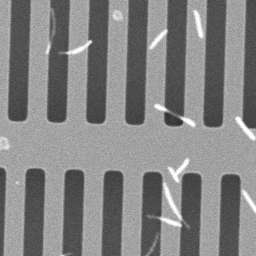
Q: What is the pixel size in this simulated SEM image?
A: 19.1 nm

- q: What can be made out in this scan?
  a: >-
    groups of lines, slits or small figures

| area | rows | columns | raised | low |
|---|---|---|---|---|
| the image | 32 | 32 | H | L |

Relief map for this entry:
HLLLHHLLLHHLLLHHLLLHHLLHHHLLHHHL
HLLLHHLLLHHLLLHHLLLHHLLHHHLLHHHL
HLLLHHLLLHHLLLHHLLHHHLLHHHLLHHHL
HLLLHHLLLHHLLLHHLLHHHLLHHHLLHHHL
HLLLHHLLLHHLLLHHLLHHHLLHHHLLHHLL
HLLLHHLLLHHLLLHHLLHHHLLHHHLLHHLL
HLLLHHLLHHHLLHHHLLHHHLLHHHLLHHLL
HLLLHHLLLHHLLHHHLLHHHLLHHHLLHHLL
HLLLHHLLLHHLLHHHLLHHHLLHHLLLHHLL
HLLLHHLLHHHLLHHHLLHHHLLHHLLLHHLL
HLLLHHLLHHHLLHHHLLHHHLLHHLLLHHLL
HLLLHHLLHHHLLHHHLLHHLLLHHLLLHHLL
HLLLHHLLHHHLLHHHLLHHLLLHHLLLHHLL
HLLHHHLLHHHLLHHHLLHHHLLHHLLLHHLL
HLLHHHLLHHHLLHHHLLHHHLLHHLLLHHLL
HHHHHHHHHHHHHHHHLLHHHLLHHLLLHHLL
HHHHHHHHHHHHHHHHHHHHHHHHHHHHHHHH
HHHHHHHHHHHHHHHHHHHHHHHHHHHHHHHH
HHHHHHHHHHHHHHHHHHHHHHHHHHHHHHHH
HHHHHHHHHHHHHHHHHHHHHHHHHHHHHHHH
HHHHHHHHHHHHHHHHHHHHHHHHHHHHHHHH
LHHLLLHHLLHHHLLHHHLLHHHHHHHHHHHH
LHHLLLHHLLLHHLLHHHLLHHHLLHHHLLHH
LHHLLLHHLLLHHLLHHHLLHHHLLHHLLLHH
LHHLLLHHLLHHHLLHHHLLHHHLLHHLLLHH
LHHLLLHHLLHHHLLHHHLLHHHLLHHLLLHH
LHHLLLHHLLHHHLLHHHLLHHLLLHHLLLHH
LHHLLLHHLLHHHLLHHHLLHHHLLHHLLLHH
LHHLLHHHLLHHHLLHHHLLHHHLLHHLLLHH
LHHLLHHHLLHHHLLHHHLLHHLLLHHLLLHH
LHHLLHHHLLHHHLLHHLLLHHLLLHHLLLHH
LHHLLHHHLLHHHLLHHLLLHHLLLHHLLLHH